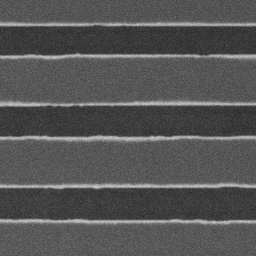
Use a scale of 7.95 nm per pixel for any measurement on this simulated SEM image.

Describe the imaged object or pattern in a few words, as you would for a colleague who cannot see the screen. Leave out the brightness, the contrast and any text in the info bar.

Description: lines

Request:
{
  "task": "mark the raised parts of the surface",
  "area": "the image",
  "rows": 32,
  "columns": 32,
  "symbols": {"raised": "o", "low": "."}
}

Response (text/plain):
oooooooooooooooooooooooooooooooo
oooooooooooooooooooooooooooooooo
oooooooooooooooooooooooooooooooo
................................
................................
................................
................................
oooooooooooooooooooooooooooooooo
oooooooooooooooooooooooooooooooo
oooooooooooooooooooooooooooooooo
oooooooooooooooooooooooooooooooo
oooooooooooooooooooooooooooooooo
oooooooooooooooooooooooooooooooo
................................
................................
................................
................................
oooooooooooooooooooooooooooooooo
oooooooooooooooooooooooooooooooo
oooooooooooooooooooooooooooooooo
oooooooooooooooooooooooooooooooo
oooooooooooooooooooooooooooooooo
oooooooooooooooooooooooooooooooo
...........oo...................
................................
................................
................................
oooooo...oo..........o..o.......
oooooooooooooooooooooooooooooooo
oooooooooooooooooooooooooooooooo
oooooooooooooooooooooooooooooooo
oooooooooooooooooooooooooooooooo